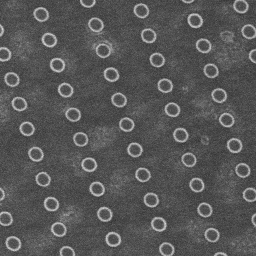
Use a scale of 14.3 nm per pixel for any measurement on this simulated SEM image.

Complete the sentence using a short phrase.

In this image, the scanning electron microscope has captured a regular array of raised bodies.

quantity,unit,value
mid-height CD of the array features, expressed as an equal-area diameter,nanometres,192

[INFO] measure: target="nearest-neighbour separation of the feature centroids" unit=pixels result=25.9